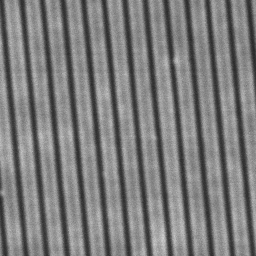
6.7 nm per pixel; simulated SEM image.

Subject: parallel lines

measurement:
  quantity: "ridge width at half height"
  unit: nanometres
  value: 96.7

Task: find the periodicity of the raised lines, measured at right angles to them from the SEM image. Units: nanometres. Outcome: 138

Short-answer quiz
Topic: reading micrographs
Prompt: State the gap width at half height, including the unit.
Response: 6.34 pixels